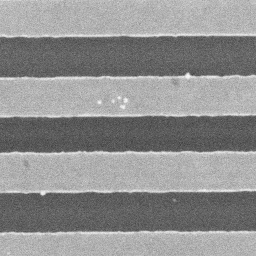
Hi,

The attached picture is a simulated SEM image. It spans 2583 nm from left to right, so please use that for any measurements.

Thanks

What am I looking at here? lines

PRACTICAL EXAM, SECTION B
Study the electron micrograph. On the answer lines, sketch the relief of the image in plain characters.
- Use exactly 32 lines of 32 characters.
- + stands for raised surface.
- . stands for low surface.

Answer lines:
++++++++++++++++++++++++++++++++
++++++++++++++++++++++++++++++++
++++++++++++++++++++++++++++++++
++++++++++++++++++++++++++++++++
+++++++++++++++.++++.+..........
................................
................................
................................
................................
.......................+.....+.+
++++++++++++++++++++++++++++++++
++++++++++++++++++++++++++++++++
++++++++++++++++++++++++++++++++
++++++++++++++++++++++++++++++++
+++++++++.......................
................................
................................
................................
................................
++++++++++++++++++++++++++++++++
++++++++++++++++++++++++++++++++
++++++++++++++++++++++++++++++++
++++++++++++++++++++++++++++++++
++++++++++++++++++++++++++++++++
................................
................................
................................
................................
................................
++++++++++++++++++++++++++++++++
++++++++++++++++++++++++++++++++
++++++++++++++++++++++++++++++++